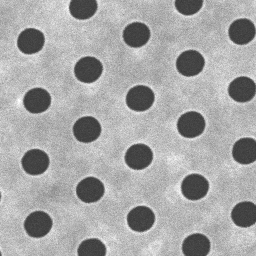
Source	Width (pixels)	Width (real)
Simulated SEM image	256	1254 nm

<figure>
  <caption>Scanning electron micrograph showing a regular array of holes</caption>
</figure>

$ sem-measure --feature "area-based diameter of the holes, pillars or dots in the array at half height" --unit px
27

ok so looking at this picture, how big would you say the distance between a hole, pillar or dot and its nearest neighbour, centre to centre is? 288 nanometers